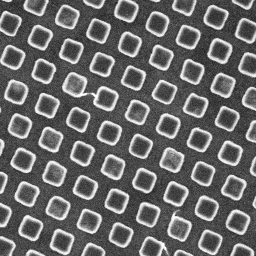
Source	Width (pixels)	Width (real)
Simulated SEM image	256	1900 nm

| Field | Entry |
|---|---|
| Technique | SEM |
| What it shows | a regular array of raised bodies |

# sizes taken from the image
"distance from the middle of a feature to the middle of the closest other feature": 0.251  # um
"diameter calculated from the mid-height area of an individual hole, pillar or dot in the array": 163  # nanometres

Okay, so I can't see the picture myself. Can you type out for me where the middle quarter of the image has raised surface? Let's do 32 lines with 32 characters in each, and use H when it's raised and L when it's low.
LLLLLLLHHHHHLLLLLLLLLLLHHHLLLLHH
LLLLLLLHHHHHLLLLHHHLLLLLLLLLLLHH
LHHLLLLLLHHLLLLHHHHHLLLLLLLLLHHH
LHHHHLLLLLLLLLLHHHHHLLLLLLLLLLHH
HHHHHLLLLLLLLLHHHHHHLLLLHLLLLLLL
HHHHHLLLLLLLLLLLHHHLLLLHHHHHLLLL
HHHHHLLLLHHHLLLLLLLLLLLHHHHHLLLL
LLHHHLLLHHHHHLLLLLLLLLHHHHHHLLLL
LLLLLLLLHHHHHLLLLLLLLLLHHHHLLLLH
LLLLLLLLHHHHHLLLLHHLLLLLHHHLLLLH
LLLLLLLLHHHHLLLLHHHHHLLLLLLLLLHH
LLHHLLLLLLLLLLLLHHHHHLLLLLLLLLHH
LLHHHHLLLLLLLLLLHHHHHLLLLLLLLLLH
LHHHHHLLLLLLLLLLHHHHLLLLHHHHLLLL
LHHHHHLLLLLLLLLLLHHHLLLLHHHHHLLL
LHHHHHLLLHHHHLLLLLLLLLLHHHHHHLLL
LLLHHLLLLHHHHHLLLLLLLLLHHHHHLLLL
LLLLLLLLLHHHHHLLLLLLLLLLHHHHLLLL
LLLLLLLLLHHHHHLLLHHHLLLLLLLLLLLH
LLLHLLLLLLHHHLLLLHHHHHLLLLLLLLLH
LLLHHHLLLLLLLLLLLHHHHHLLLLLLLLLH
LLHHHHHLLLLLLLLLHHHHHLLLLLHHLLLL
LLHHHHHLLLLLLLLLLHHHHLLLLHHHHLLL
LLHHHHHLLLLHHLLLLLLLLLLLLHHHHHLL
LLLHHHLLLLHHHHHLLLLLLLLLHHHHHHLL
LLLLLLLLLLHHHHHLLLLLLLLLHHHHHLLL
LLLLLLLLLLHHHHHLLLLHLLLLLLLHLLLL
LLLLLLLLLLHHHHLLLLHHHHLLLLLLLLLL
LLLLHHLLLLLLHHLLLLHHHHHLLLLLLLLL
LLLHHHHHLLLLLLLLLHHHHHHLLLLLLLLL
LLLHHHHHLLLLLLLLLHHHHHLLLLHHHLLL
LLLHHHHHLLLLHLLLLLLHHHLLLLHHHHHL